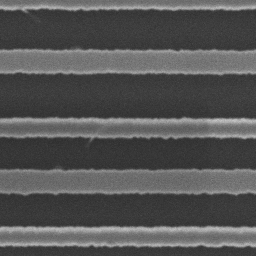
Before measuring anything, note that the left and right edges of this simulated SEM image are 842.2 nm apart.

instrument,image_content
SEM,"lines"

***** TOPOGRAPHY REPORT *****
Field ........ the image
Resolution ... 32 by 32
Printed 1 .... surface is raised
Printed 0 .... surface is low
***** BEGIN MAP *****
11111111111111111111111111111111
00000000000000000000000000000000
00000000000000000000000000000000
00000000000000000000000000000000
00000000000000000000000000000000
00000000000000000000000000000000
11111111111111111111111111111111
11111111111111111111111111111111
11111111111111111111111111111111
00000000000000000000000000000000
00000000000000000000000000000000
00000000000000000000000000000000
00000000000000000000000000000000
00000000000000000000000000000000
00000000000000000000000000000000
11111111111111111111111111111111
11111111111111111111111111111111
00000000000000000000000000000000
00000000000000000000000000000000
00000000000000000000000000000000
00000000000000000000000000000000
11111111111111111111111111111111
11111111111111111111111111111111
11111111111111111111111111111111
00000000000000000000000000000000
00000000000000000000000000000000
00000000000000000000000000000000
00000000000000000000000000000000
00000000000000000000000000000000
11111111111111111111111111111111
11111111111111111111111111111111
00000000000000000000000000000000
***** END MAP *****